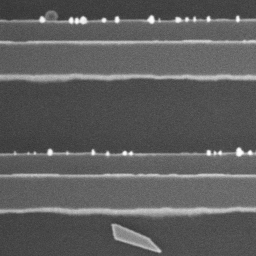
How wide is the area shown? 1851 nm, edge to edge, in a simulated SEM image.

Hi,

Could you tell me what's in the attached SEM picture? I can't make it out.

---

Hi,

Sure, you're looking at lines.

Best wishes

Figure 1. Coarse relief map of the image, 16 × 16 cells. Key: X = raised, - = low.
----------------
XXXXXXXXXXXXXXXX
XXXXXXXXXXXXXXXX
XXXXXXXXXXXXXXXX
XXXXXXXXXXXXXXXX
----------------
----------------
----------------
----------------
--------------X-
XXXXXXXXXXXXXXXX
XXXXXXXXXXXXXXXX
XXXXXXXXXXXXXXXX
----------------
----------------
----------------